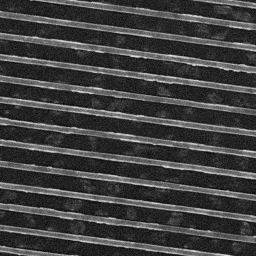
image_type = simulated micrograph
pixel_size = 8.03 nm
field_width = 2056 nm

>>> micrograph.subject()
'parallel lines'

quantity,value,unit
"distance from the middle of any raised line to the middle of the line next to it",21.2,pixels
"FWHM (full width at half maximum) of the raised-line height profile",45.7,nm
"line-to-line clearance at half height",126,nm